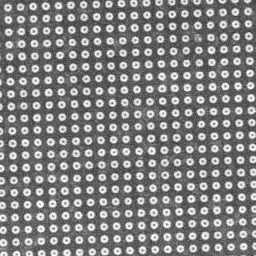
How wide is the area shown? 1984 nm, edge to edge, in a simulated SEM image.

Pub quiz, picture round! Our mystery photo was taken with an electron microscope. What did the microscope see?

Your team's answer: a regular array of raised bodies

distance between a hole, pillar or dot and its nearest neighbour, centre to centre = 94.9 nm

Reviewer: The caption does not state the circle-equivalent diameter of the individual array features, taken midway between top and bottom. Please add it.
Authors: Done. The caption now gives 45.4 nanometers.